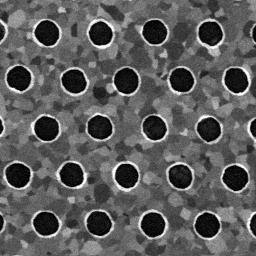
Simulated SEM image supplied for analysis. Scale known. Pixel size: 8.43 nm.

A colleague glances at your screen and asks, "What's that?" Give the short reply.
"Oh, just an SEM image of a regular array of holes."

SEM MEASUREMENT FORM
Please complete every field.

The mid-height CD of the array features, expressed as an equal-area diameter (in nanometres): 215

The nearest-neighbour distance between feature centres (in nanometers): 450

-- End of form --